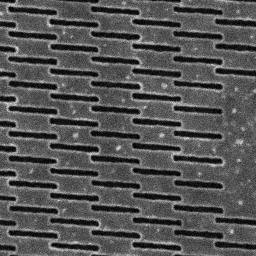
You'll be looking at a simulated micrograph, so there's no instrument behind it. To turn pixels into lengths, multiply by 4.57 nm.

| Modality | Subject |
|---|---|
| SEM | a regular array of holes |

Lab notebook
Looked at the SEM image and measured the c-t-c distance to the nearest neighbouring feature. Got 113 nm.